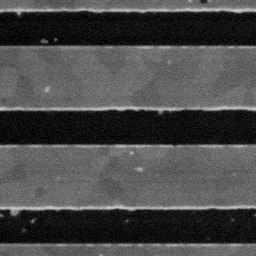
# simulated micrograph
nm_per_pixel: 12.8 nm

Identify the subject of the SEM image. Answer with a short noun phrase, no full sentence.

lines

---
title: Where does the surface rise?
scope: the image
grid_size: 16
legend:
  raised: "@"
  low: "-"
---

@@@@@@@@@@@@@@@@
----------------
----------------
@@@@@@@@@@@@@@@@
@@@@@@@@@@@@@@@@
@@@@@@@@@@@@@@@@
@@@@@@@@@@@@@@@@
----------------
----------------
@@@@@@@@@@@@@@@@
@@@@@@@@@@@@@@@@
@@@@@@@@@@@@@@@@
@@@@@@@@@@@@@@@@
----------------
----------------
@@@@@@@@@@@@@@@@